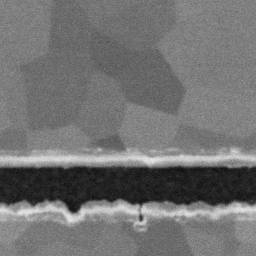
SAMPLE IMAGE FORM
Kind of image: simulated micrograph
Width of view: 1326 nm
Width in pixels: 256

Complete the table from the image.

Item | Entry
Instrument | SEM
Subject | one or a few lines or trenches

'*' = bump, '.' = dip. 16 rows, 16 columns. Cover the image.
****************
****************
****************
****************
****************
****************
****************
****************
****************
****************
................
................
................
****************
****************
****************